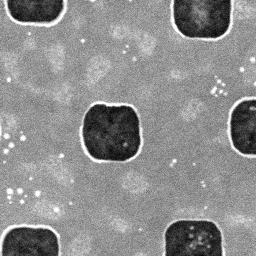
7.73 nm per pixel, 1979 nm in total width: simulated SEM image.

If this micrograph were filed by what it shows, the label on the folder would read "holes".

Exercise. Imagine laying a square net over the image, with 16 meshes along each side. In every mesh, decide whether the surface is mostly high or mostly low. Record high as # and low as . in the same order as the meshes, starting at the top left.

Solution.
....#######...##
###########...##
################
################
################
################
###############.
#####....#####..
#####....#####..
######...######.
################
################
################
################
#..#######....##
....######....##